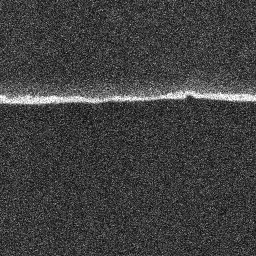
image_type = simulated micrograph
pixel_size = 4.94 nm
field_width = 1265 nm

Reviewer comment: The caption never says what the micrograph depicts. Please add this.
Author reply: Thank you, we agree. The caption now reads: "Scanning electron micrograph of one or a few lines or trenches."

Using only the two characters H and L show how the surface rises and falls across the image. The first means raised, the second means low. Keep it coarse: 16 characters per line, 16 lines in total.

HHHHHHHHHHHHHHHH
HHHHHHHHHHHHHHHH
HHHHHHHHHHHHHHHH
HHHHHHHHHHHHHHHH
HHHHHHHHHHHHHHHH
HHHHHHHHHHHHHHHH
LLLLLLLLLLLLLLLL
LLLLLLLLLLLLLLLL
LLLLLLLLLLLLLLLL
LLLLLLLLLLLLLLLL
LLLLLLLLLLLLLLLL
LLLLLLLLLLLLLLLL
LLLLLLLLLLLLLLLL
LLLLLLLLLLLLLLLL
LLLLLLLLLLLLLLLL
LLLLLLLLLLLLLLLL